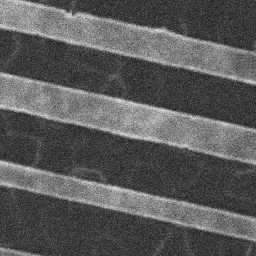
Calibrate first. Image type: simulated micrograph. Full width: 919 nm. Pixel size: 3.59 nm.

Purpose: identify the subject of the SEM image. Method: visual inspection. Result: one or a few lines or trenches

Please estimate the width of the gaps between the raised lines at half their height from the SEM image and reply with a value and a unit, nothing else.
190 nm